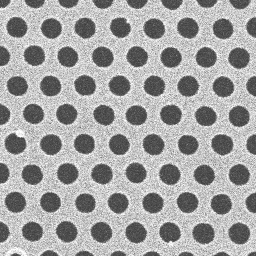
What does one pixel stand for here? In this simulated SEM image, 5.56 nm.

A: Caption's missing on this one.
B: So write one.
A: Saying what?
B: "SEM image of a regular array of holes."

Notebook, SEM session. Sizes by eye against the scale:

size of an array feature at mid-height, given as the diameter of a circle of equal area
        0.119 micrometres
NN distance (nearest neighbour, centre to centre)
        0.184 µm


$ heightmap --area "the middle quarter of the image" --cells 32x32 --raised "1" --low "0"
00011111000111111000111110001111
11111111111111111111111111111111
11111111111111111111111111111111
11100001111100001111100011111000
11100000111000001111000001111000
11100000111000000111000001110000
11100000111000001111000001110000
11110001111100001111100011111000
11111111111111111111111111111111
11111111111111111111111111111111
00111111100111111001111110001111
00011110000011110000111100000111
00011110000001100000011100000011
00011111000001100000011100000111
00011111000011110000111110000111
11111111110111111111111111111111
11111111111111111111111111111111
11110011111110111111111111111111
11100001111100001111000011111000
11000000111000001111000001110000
11000000111000001111000001110000
11100001111100001111000001111000
11110011111100011111100011111100
11111111111111111111111111111111
11111111111111111111111111111111
00011111000111110000111110001111
00011110000011100000011100000111
00001110000011100000011100000111
00011110000011110000111100000111
00111111000111111000111110001111
11111111111111111111111111111111
11111111111111111111111111111111